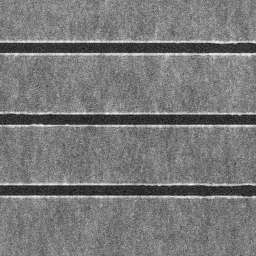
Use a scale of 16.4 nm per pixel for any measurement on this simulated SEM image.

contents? lines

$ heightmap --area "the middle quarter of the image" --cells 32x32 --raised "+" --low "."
++++++++++++++++++++++++++++++++
++++++++++++++++++++++++++++++++
++++++++++++++++++++++++++++++++
++++++++++++++++++++++++++++++++
++++++++++++++++++++++++++++++++
++++++++++++++++++++++++++++++++
++++++++++++++++++++++++++++++++
++++++++++++++++++++++++++++++++
++++++++++++++++++++++++++++++++
++++++++++++++++++++++++++++++++
++++++++++++++++++++++++++++++++
++++++++++++++++++++++++++++++++
................................
................................
................................
++++++++++++++++++++++++++++++++
++++++++++++++++++++++++++++++++
++++++++++++++++++++++++++++++++
++++++++++++++++++++++++++++++++
++++++++++++++++++++++++++++++++
++++++++++++++++++++++++++++++++
++++++++++++++++++++++++++++++++
++++++++++++++++++++++++++++++++
++++++++++++++++++++++++++++++++
++++++++++++++++++++++++++++++++
++++++++++++++++++++++++++++++++
++++++++++++++++++++++++++++++++
++++++++++++++++++++++++++++++++
++++++++++++++++++++++++++++++++
++++++++++++++++++++++++++++++++
................................
................................